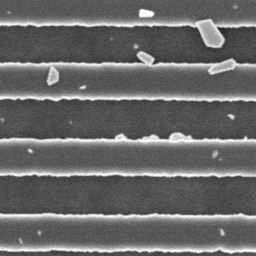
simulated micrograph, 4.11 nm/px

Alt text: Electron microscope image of lines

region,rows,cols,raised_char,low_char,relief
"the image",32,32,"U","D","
UUUUUUUUUUUUUUUUUUUUUUUUUUUUUUUU
UUUUUUUUUUUUUUUUUUUUUUUUUUUUUUUU
UUUUUUUUUUUUUUUUUUUUUUUUUUUUUUUU
DDDDDDDDDDDDDDDDDDDDDDDDDUUUDDDD
DDDDDDDDDDDDDDDDDDDDDDDDDUUUDDDD
DDDDDDDDDDDDDDDDDDDDDDDDDDUUDDDD
DDDDDDDDDDDDDDDDDDDDDDDDDDDDDDDD
DDDDDDDDDDDDDDDDDDUDDDDDDDDDDDDD
UUUUUUUUUUUUUUUUUUUUUUUUUUUUUUUU
UUUUUUUUUUUUUUUUUUUUUUUUUUUUUUUU
UUUUUUUUUUUUUUUUUUUUUUUUUUUUUUUU
UUUUUUUUUUUUUUUUUUUUUUUUUUUUUUUU
DDDDDDUDDDDUDDUDDDDDDUUUUUUUUUUU
DDDDDDDDDDDDDDDDDDDDDDDDDDDDDDDD
DDDDDDDDDDDDDDDDDDDDDDDDDDDDDDDD
DDDDDDDDDDDDDDDDDDDDDDDDDDDDDDDD
DDDDDDDDDDDDDDDDDDDDDDDDDDDDDDDD
UUUUUUUUUUUUUUUUUUUUUDUUUUUUUUUU
UUUUUUUUUUUUUUUUUUUUUUUUUUUUUUUU
UUUUUUUUUUUUUUUUUUUUUUUUUUUUUUUU
UUUUUUUUUUUUUUUUUUUUUUUUUUUUUUUU
UUUUUUUUUUUUUUUUUUUUUUUUUUUUUUUU
DDDDDDDDDDDDDDDDDDDDDDDDDDDDDDDD
DDDDDDDDDDDDDDDDDDDDDDDDDDDDDDDD
DDDDDDDDDDDDDDDDDDDDDDDDDDDDDDDD
DDDDDDDDDDDDDDDDDDDDDDDDDDDDDDDD
DDDDDDDDDDDDDDDDDDDDDDDDDDDDDDDD
UUUUUUUUUUUUUUUUUUUUUUUUUUUUUUUU
UUUUUUUUUUUUUUUUUUUUUUUUUUUUUUUU
UUUUUUUUUUUUUUUUUUUUUUUUUUUUUUUU
UUUUUUUUUUUUUUUUUUUUUUUUUUUUUUUU
DDDDDDDDDDDDDDDDDDDDDDDDDDDDUDDD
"